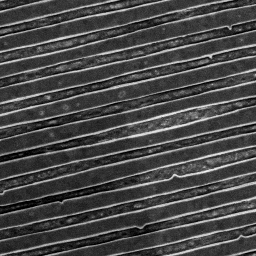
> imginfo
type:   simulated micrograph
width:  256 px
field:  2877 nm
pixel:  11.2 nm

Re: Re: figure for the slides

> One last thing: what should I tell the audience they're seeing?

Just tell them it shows parallel lines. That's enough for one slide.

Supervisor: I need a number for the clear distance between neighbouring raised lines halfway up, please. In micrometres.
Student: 0.119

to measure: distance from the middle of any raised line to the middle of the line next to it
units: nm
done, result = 280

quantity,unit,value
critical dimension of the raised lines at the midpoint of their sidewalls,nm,163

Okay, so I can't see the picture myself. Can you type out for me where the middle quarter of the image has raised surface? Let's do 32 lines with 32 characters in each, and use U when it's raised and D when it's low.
DDDDDDDDDUUUUUUUUUUUUUUUDDDDDDDD
DDDDDUUUUUUUUUUUUUUUDDDDDDDDDDDD
UUUUUUUUUUUUUUUDDDDDDDDDDDDDUUUU
UUUUUUUUUUUUDDDDDDDDDDDUUUUUUUUU
UUUUUUUUDDDDDDDDDDDUUUUUUUUUUUUU
UUUDDDDDDDDDDDUUUUUUUUUUUUUUUUUD
DDDDDDDDDDUUUUUUUUUUUUUUUUUDDDDD
DDDDDDUUUUUUUUUUUUUUUUUDDDDDDDDD
DUUUUUUUUUUUUUUUUUDDDDDDDDDDDDUU
UUUUUUUUUUUUUUDDDDDDDDDDDDUUUUUU
UUUUUUUUUDDDDDDDDDDDDDUUUUUUUUUU
UUUUUDDDDDDDDDDDDDUUUUUUUUUUUUDD
UDDDDDDDDDDDDUUUUUUUUUUUUUUDDDDD
DDDDDDDDDUUUUUUUUUUUUUUDDDDDDDDD
DDDUUUUUUUUUUUUUUUUDDDDDDDDDDDDD
UUUUUUUUUUUUUUUDDDDDDDDDDDDDDUUU
UUUUUUUUUUUDDDDDDDDDDDDDDUUUUUUU
UUUUUUUDDDDDDDDDDDDDUUUUUUUUUUUU
UUDDDDDDDDDDDDDUUUUUUUUUUUUUUUUD
DDDDDDDDDDDUUUUUUUUUUUUUUUDDDDDD
DDDDDDUUUUUUUUUUUUUUUUDDDDDDDDDD
UUUUUUUUUUUUUUUUDDDDDDDDDDDDUUUU
UUUUUUUUUUUUDDDDDDDDDDDUUUUUUUUU
UUUUUUUDDDDDDDDDDDDDUUUUUUUUUUUU
UUDDDDDDDDDDDDUUUUUUUUUUUUUUUUDD
DDDDDDDDDDUUUUUUUUUUUUUUUUDDDDDD
DDDDDDUUUUUUUUUUUUUUUUDDDDDDDDDD
DDUUUUUUUUUUUUUUUUDDDDDDDDDDDDDD
UUUUUUUUUUUUUUUDDDDDDDDDDDDUUUUU
UUUUUUUUUUUDDDDDDDDDDDDUUUUUUUUU
UUUUUUUDDDDDDDDDDDUUUUUUUUUUUUUU
UUUDDDDDDDDDDUUUUUUUUUUUUUUUUDDD